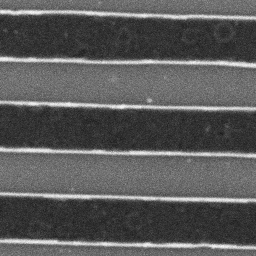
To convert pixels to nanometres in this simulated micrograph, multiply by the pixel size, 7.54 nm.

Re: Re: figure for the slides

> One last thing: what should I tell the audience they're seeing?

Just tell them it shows one or a few lines or trenches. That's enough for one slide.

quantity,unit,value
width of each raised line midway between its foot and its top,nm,362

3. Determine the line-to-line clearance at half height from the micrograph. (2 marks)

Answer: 327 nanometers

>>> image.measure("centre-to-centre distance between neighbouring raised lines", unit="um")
0.688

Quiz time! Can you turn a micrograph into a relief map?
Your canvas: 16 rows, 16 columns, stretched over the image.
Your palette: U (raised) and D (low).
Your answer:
DDDDDDDDDDDDDDDD
UUUUUUUUUUUUUUUU
UUUUUUUUUUUUUUUU
UUUUUUUUUUUUUUUU
DDDDDDDDDDDDDDDD
DDDDDDDDDDDDDDDD
UUUUUDDDDDDDDDDD
UUUUUUUUUUUUUUUU
UUUUUUUUUUUUUUUU
DDDDDUUUUUUUUUUU
DDDDDDDDDDDDDDDD
DDDDDDDDDDDDDDDD
UUUUUUUUUUUUUUUD
UUUUUUUUUUUUUUUU
UUUUUUUUUUUUUUUU
DDDDDDDDDDDDDDDD